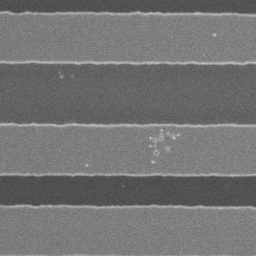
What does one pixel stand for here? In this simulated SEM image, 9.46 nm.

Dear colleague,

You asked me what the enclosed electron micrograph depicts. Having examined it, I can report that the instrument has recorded lines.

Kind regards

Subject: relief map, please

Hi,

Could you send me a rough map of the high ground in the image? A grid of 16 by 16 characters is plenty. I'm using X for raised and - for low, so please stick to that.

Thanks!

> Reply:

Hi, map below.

----------------
XXXXXXXXXXXXXXXX
XXXXXXXXXXXXXXXX
XXXXXXXXXXXXXXXX
----------------
----------------
----------------
----------------
XXXXXXXXXXXXXXXX
XXXXXXXXXXXXXXXX
XXXXXXXXXXXXXXXX
----------------
----------------
XXXXXXXXXXXXXXXX
XXXXXXXXXXXXXXXX
XXXXXXXXXXXXXXXX